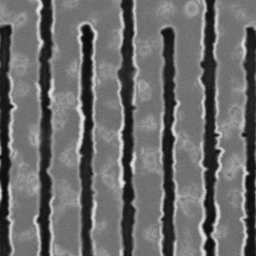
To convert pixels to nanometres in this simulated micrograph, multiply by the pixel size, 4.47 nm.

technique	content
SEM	parallel lines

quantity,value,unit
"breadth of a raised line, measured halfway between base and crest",0.139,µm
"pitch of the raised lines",0.184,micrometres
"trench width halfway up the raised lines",0.0447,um